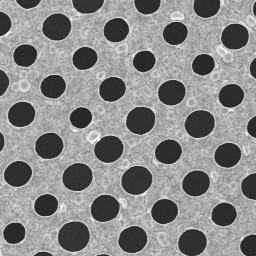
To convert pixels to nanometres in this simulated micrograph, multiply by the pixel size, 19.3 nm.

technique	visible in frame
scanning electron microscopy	a regular array of holes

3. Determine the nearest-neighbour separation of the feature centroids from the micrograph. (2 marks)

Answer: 806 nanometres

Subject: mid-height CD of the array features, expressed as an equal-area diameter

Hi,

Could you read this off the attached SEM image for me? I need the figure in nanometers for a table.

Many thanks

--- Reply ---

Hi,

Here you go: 504